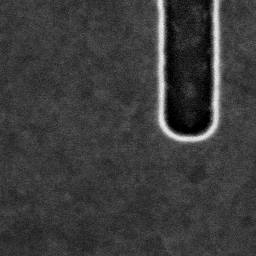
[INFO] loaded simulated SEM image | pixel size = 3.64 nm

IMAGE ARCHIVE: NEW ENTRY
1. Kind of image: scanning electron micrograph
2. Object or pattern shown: one or a few lines or trenches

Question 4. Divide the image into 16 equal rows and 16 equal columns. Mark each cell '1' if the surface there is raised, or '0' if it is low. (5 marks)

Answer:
1111111111000011
1111111111000011
1111111111000011
1111111111000011
1111111111000011
1111111111000011
1111111111000111
1111111111000111
1111111111100111
1111111111111111
1111111111111111
1111111111111111
1111111111111111
1111111111111111
1111111111111111
1111111111111111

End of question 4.